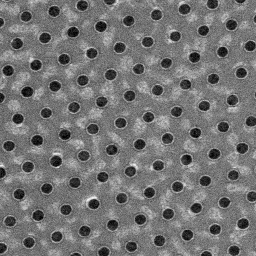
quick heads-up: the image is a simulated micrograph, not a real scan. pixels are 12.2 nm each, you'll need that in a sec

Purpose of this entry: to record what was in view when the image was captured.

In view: a regular array of raised bodies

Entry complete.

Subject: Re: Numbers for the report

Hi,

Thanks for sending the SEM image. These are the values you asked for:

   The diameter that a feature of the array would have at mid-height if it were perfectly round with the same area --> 151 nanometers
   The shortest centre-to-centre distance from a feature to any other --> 345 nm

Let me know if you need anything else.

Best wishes